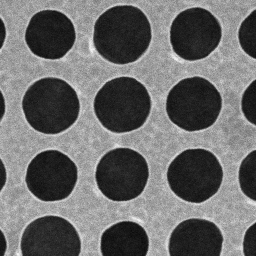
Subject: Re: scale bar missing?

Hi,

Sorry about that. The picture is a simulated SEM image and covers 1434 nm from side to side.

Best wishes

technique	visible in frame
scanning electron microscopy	a regular array of holes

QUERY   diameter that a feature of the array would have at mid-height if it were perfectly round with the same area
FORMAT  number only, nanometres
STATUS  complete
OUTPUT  307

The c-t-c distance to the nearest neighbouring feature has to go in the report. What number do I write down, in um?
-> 0.392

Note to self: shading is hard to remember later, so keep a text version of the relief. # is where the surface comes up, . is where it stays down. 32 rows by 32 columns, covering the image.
################################
#####...#####.....#####...######
####.....###.......###.....####.
.##......###.......##.......##..
.##......###.......##.......##..
###......###.......##......###..
####....####......####....#####.
#############....###############
################################
################################
####.....####.....####....#####.
###.......##......###......###..
.##.......##.......##.......##..
.##.......##.......##.......##..
###.......##.......##......####.
####.....####.....####.....#####
#####...######..################
################################
###############.################
####....#####.....####.....####.
####.....###......###......###..
.##.......##.......##.......##..
.##.......##.......##.......##..
###......###......###......###..
####....#####....#####.....####.
################################
################################
####....###############...######
###......#####....####.....####.
.##.......###.....###.......###.
.##.......###......##.......##..
.##.......###.....###.......##..